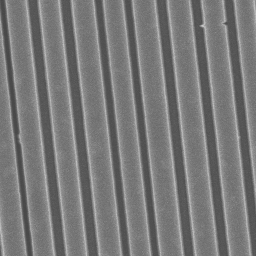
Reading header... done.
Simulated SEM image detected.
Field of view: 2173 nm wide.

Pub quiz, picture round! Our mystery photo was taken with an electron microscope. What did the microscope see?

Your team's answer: parallel lines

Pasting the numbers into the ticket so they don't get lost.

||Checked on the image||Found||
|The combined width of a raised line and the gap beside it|32.5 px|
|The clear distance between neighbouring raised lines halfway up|87.6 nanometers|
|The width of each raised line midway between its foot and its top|190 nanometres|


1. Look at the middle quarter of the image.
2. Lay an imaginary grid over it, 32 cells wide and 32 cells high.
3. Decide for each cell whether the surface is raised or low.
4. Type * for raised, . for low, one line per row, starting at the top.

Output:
*..******..******..******...****
*...*****...*****..******...****
*...******..*****..******...****
*...******..*****..******...****
*...******..*****..******...****
*...******..*****..******...****
*...******..*****..******...****
**..******..*****...*****...****
**...*****..******..******..****
**...*****...*****..******...***
**...*****...*****..******...***
**...******..*****..******...***
**...******..*****..******...***
**...******..*****..******...***
**...******..*****..******...***
**...******..*****..******...***
**...******..*****...*****...***
***...*****..******..******..***
***...*****..******..******...**
***...*****...*****..******...**
***...******..*****..******...**
***...******..*****..******...**
***...******..*****..******...**
***...******..*****..******...**
***...******..*****..******...**
***...******..*****...*****...**
****...*****..******..*****...**
****...*****..******..******...*
****...*****...*****..******...*
****...******..*****..******...*
****...******..*****..******...*
****...******..*****..******...*